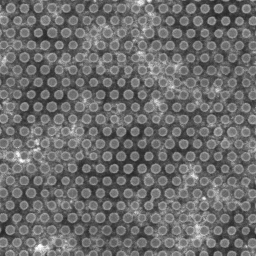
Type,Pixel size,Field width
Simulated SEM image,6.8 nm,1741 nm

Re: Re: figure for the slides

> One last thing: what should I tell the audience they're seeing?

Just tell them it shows a regular array of raised bodies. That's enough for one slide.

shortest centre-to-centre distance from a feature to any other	92.7	nm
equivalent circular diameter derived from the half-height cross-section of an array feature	56.4	nm